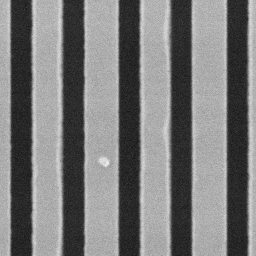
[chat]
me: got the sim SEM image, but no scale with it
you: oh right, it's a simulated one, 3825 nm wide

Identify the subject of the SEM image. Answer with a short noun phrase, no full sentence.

lines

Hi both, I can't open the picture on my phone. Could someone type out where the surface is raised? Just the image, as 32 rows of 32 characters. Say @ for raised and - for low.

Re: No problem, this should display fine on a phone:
@---@@@@---@@@@---@@@---@@@@---@
@---@@@@---@@@@---@@@---@@@@---@
@---@@@@---@@@@--@@@@---@@@@---@
@---@@@@---@@@@--@@@@---@@@@---@
@---@@@@---@@@@--@@@@---@@@@---@
@---@@@@---@@@@--@@@@---@@@@---@
@---@@@@---@@@@---@@@---@@@@---@
@---@@@@---@@@@--@@@@---@@@@---@
@---@@@@---@@@@--@@@@---@@@@---@
@---@@@@---@@@@--@@@@---@@@@---@
@---@@@@---@@@@---@@@---@@@@---@
@---@@@@---@@@@--@@@@---@@@@---@
@---@@@@---@@@@---@@@---@@@@---@
@---@@@@---@@@@---@@@---@@@@---@
@---@@@@---@@@@---@@@---@@@@---@
@---@@@@---@@@@--@@@@---@@@@---@
@---@@@@---@@@@---@@@---@@@@---@
@---@@@@---@@@@---@@@---@@@@---@
@---@@@@---@@@@---@@@---@@@@---@
@---@@@@---@@@@---@@@---@@@@---@
@---@@@@---@@@@---@@@---@@@@---@
@---@@@@---@@@@---@@@---@@@@---@
@---@@@@---@@@@--@@@@---@@@@---@
@---@@@@---@@@@--@@@@---@@@@---@
@---@@@@---@@@@--@@@@---@@@@---@
@---@@@@---@@@@--@@@@---@@@@---@
@---@@@@---@@@@---@@@---@@@@---@
@---@@@@---@@@@--@@@@---@@@@---@
@---@@@@---@@@@---@@@---@@@@---@
@---@@@@---@@@@--@@@@---@@@@---@
@---@@@@---@@@@--@@@@---@@@@---@
@---@@@@---@@@@---@@@---@@@@---@